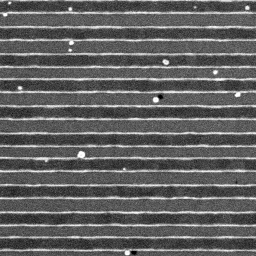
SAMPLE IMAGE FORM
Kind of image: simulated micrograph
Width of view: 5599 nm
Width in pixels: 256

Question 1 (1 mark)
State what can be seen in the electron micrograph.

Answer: wiring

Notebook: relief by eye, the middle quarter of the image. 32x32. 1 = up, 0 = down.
11111111111111111111111111111111
00000000000000000000000000000000
00000000000000000000000000000000
00000000000000000000000000000000
11111111111111111111111111111111
11111111001111111111111111111111
11111111111111111111111111111111
00000000000000000000000000000000
00000000000000000000000000000000
00000000000000000000000000000000
01101000111001101100001100000011
11111111111111111111111111111111
11100111111111111111111111111111
11100111111111111111111111111111
00000000000000000000000000000000
00000000000000000000000000000000
00000000000000000000000000000000
11111111111111111111111111111111
11111111111111111111111100011111
11111111111111111111111111011111
11111100000000111110011111111110
00000000000000000000000000000000
00001000000000000000000000000000
00011000000000000000000000000000
11111111111111111111111111111111
11111111111111111111111111111111
11111111111111111111111111111111
00000000000000000000000000000000
00000000000000000000000000000000
00000000000000000000000000000000
11111111111111111111111111111111
11111111111111111111111111111111